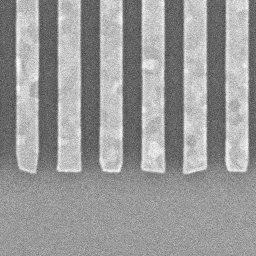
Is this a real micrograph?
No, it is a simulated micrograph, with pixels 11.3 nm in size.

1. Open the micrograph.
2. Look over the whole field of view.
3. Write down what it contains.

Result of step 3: wiring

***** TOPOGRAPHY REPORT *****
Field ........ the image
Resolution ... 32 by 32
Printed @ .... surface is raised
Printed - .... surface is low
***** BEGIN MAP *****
--@@@--@@@---@@---@@---@@@--@@@-
--@@@--@@@---@@---@@---@@@--@@@-
--@@@--@@@---@@---@@---@@@--@@@-
--@@@--@@@---@@---@@---@@@--@@@-
--@@@--@@@---@@---@@---@@@--@@@-
--@@@--@@@---@@---@@---@@@--@@@-
--@@@--@@@---@@---@@---@@@--@@@-
--@@@--@@@---@@---@@---@@@--@@@-
--@@@--@@@---@@---@@---@@@--@@@-
--@@@--@@@---@@---@@---@@@--@@@-
--@@@--@@@---@@---@@---@@@--@@@-
--@@@--@@@---@@---@@---@@@--@@@-
--@@@--@@@---@@---@@---@@@--@@@-
--@@@--@@@---@@---@@---@@@--@@@-
--@@@--@@@---@@---@@---@@@--@@@-
--@@@--@@@---@@---@@---@@@--@@@-
--@@@--@@@---@@---@@---@@@--@@@-
--@@@--@@@---@@---@@---@@@--@@@-
--@@@--@@@---@@---@@---@@@--@@@-
--@@@--@@@---@@---@@---@@@--@@@-
--@@@--@@@---@@---@@---@@@--@@@-
-----------------------@--------
--------------------------------
--------------------------------
--------------------------------
--------------------------------
--------------------------------
--------------------------------
--------------------------------
--------------------------------
--------------------------------
--------------------------------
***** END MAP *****